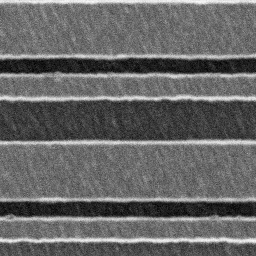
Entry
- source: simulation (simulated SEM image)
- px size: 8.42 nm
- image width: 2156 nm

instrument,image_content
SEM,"lines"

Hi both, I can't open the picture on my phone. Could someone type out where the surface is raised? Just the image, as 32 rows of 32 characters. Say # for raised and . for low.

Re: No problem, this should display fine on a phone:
################################
################################
################################
################################
################################
################################
################################
................................
................................
################################
################################
################################
................................
................................
................................
................................
................................
................................
################################
################################
################################
################################
################################
################################
################################
................................
................................
################################
################################
################################
................................
................................